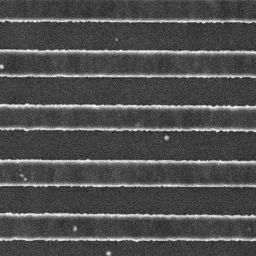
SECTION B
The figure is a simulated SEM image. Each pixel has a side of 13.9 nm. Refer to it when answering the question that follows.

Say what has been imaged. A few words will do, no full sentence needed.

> lines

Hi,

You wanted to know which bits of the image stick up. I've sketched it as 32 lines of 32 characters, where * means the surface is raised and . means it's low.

********************************
********************************
********************************
................................
................................
................................
**************************.**.**
********************************
********************************
********************************
................................
................................
................................
********************************
********************************
********************************
................................
................................
................................
................................
********************************
********************************
********************************
................................
................................
................................
................................
********************************
********************************
********************************
................................
................................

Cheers